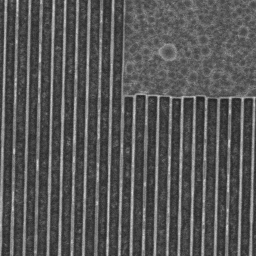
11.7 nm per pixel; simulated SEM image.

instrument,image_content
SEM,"parallel lines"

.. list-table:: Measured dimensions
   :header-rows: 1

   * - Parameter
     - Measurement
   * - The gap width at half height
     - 116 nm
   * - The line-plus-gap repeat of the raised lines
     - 139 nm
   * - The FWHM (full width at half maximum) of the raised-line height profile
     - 21.8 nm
